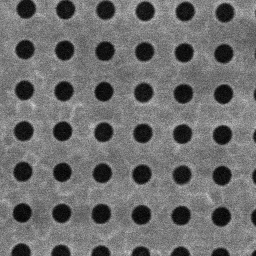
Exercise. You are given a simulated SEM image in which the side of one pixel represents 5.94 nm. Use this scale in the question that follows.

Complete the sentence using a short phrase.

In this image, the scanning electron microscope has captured a regular array of holes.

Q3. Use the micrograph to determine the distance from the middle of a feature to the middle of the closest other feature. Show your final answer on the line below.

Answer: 235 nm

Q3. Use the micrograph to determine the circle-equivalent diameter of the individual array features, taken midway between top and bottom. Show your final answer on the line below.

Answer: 118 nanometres